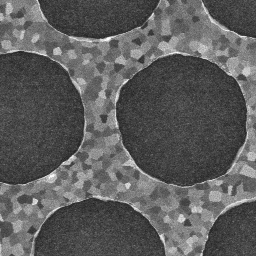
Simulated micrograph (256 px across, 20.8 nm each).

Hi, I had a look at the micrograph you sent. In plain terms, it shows holes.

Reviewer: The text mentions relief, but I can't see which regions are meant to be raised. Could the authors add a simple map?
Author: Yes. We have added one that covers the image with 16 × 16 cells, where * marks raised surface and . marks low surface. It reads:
***.......***...
***......*****..
****************
...*******..****
....*****.....**
.....***.......*
.....**........*
.....**........*
.....***.......*
.....***.......*
....*****.....**
***********.****
*****..*********
***......*****..
**........***...
**........***...